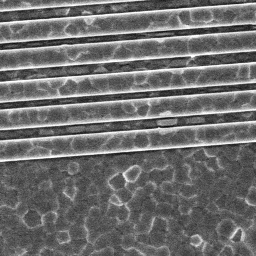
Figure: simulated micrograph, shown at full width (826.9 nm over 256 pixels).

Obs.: parallel lines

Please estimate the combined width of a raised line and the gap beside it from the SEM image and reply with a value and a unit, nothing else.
95 nm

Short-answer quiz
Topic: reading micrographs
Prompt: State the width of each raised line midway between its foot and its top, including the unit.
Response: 0.0655 µm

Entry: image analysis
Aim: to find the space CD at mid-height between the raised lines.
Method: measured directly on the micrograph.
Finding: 0.0342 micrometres